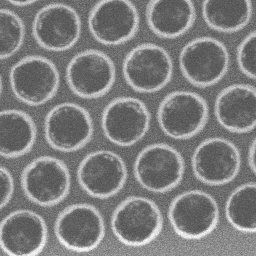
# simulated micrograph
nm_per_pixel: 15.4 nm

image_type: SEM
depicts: a regular array of raised bodies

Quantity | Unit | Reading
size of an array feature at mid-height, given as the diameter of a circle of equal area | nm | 701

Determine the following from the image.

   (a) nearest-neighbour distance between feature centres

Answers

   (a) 0.874 µm